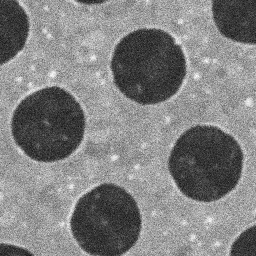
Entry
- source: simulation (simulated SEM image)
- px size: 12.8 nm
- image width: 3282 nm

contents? holes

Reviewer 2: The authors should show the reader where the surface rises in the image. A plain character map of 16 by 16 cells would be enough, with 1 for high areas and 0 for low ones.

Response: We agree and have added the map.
0111111111111000
0011111111111000
0011111100011100
0111111000001111
1111111000001111
1110111000011111
1000011110111111
1000011111111111
1000011111100001
1000011111100001
1111111111100001
1111110111100001
1111100011110011
1111000001111111
1111000001111110
0111100011111100